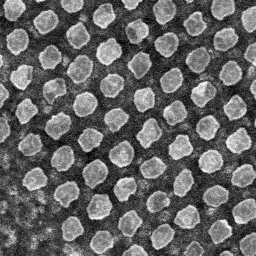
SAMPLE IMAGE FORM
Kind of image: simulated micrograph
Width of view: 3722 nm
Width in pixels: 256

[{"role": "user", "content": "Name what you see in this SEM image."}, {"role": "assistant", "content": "a regular array of raised bodies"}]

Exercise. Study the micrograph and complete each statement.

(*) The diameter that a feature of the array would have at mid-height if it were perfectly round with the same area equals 327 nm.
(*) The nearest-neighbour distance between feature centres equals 481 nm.